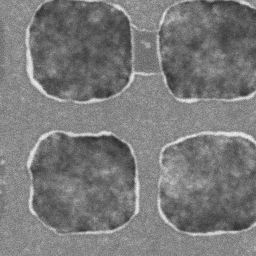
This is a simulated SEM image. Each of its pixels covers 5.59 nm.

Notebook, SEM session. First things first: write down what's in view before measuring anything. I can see holes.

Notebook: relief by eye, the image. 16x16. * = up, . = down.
**.....****.....
**......**......
**..............
**..............
**..............
***.....***.....
****************
****************
***....*****...*
**......**......
**.......*......
**.......*......
**.......*......
**......**......
****..******..**
****************